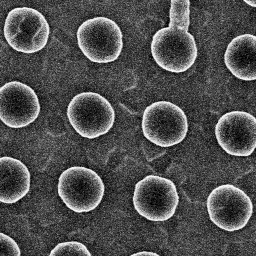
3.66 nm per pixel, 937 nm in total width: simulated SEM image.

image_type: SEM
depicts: raised bodies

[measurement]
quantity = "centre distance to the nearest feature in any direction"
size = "272 nanometers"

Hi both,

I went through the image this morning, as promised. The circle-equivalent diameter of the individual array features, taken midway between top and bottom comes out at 164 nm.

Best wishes